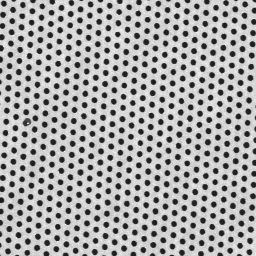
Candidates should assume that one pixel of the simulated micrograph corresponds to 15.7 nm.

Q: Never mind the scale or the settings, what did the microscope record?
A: a regular array of holes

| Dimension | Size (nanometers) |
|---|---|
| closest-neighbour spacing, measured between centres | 171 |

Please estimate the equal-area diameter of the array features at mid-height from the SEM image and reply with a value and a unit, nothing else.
91.9 nanometers